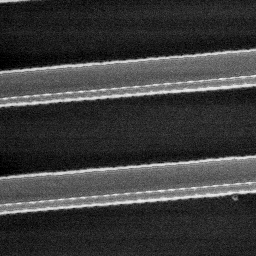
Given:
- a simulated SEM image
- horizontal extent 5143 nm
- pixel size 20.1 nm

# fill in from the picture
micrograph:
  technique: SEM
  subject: lines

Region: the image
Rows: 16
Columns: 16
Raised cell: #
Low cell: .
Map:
................
................
................
.............###
################
#############...
#...............
................
................
................
........########
################
#########.......
................
................
................